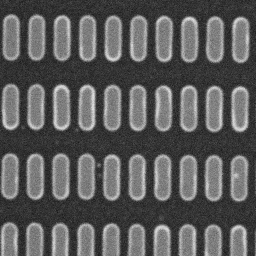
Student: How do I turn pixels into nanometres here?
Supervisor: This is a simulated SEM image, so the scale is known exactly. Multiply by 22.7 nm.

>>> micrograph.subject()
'groups of lines, slits or small figures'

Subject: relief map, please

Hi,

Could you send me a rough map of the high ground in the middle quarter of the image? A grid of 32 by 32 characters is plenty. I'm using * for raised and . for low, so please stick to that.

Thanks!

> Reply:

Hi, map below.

................................
................................
................................
................................
................................
................................
*...***....***...***...***....**
*...***...****...***...****...**
*...***...****...***...****...**
*...***...****...***...****...**
*...***...****...***...****...**
*...***...****...***...****...**
*...***...****...***...****...**
*...***...****...***...****...**
*...***...****...***...****..***
*...***...****...***...****...**
........................*......*
................................
................................
................................
................................
................................
................................
*...***....**....***...***....**
*...***...****...***...****..***
*...***...****...***...****..***
*...***...****...***...***...***
*...***...****...***...***...***
*...***...***....***...***...***
*...***...****...***...***...***
*...***...****..****...****..***
*...***...****..****...****..***